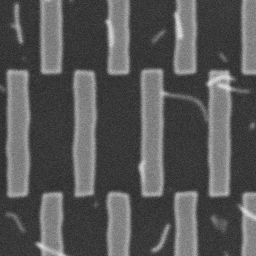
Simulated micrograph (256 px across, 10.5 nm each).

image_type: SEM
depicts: groups of lines, slits or small figures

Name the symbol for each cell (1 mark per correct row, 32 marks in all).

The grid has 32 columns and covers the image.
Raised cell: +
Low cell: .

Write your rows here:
.....+++......++......++......++
.....+++......++......++......++
.....+++......++......++......++
.....+++......++......++......++
.....+++......++......++......++
.....+++......++......++......++
.....+++......++......++......++
.....+++......++......++......++
.....+++......++......++......++
.++......+++......++......+++...
.++......+++......++......+++...
.++......+++......++......+++...
.++......+++......++......+++...
.+++.....+++......++......+++...
.+++.....+++......++......+++...
.+++.....+++......++......+++...
.++......+++......++......+++...
.++......+++......++......+++...
.+++.....+++......++......+++...
.+++.....+++......++......+++...
.+++.....+++......++......+++...
.+++.....+++......++......+++...
.++......+++......++......+++...
.++.......++......++......+++...
.+....++......++......+++.....++
.....+++......++......++......++
.....+++......++......++......++
.....+++......++......++......++
.....+++......++......++......++
.....+++......++......+++.....++
.....+++......++......+++.....++
.....+++......++......+++.....++